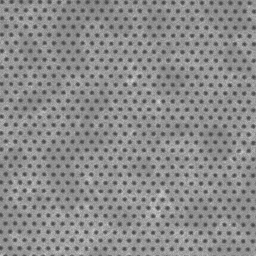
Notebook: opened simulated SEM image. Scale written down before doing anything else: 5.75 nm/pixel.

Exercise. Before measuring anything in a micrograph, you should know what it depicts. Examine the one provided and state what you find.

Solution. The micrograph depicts a regular array of holes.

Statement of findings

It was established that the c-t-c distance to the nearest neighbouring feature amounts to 52.4 nm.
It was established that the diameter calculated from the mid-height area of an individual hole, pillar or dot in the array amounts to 28.3 nm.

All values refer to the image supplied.